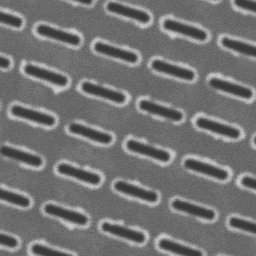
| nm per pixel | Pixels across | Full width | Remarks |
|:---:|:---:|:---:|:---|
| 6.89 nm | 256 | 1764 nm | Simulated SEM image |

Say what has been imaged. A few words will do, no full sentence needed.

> a regular array of holes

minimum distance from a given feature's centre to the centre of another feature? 290 nm